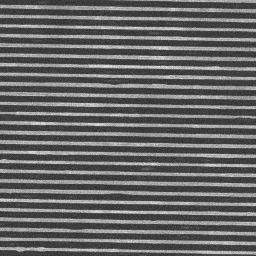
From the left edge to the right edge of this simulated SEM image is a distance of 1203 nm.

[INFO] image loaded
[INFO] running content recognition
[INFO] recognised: parallel lines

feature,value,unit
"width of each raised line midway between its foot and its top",0.0164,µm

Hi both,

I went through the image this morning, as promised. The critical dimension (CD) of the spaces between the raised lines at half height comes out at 29.3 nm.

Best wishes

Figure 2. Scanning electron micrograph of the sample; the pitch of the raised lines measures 45.5 nm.